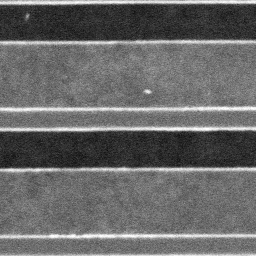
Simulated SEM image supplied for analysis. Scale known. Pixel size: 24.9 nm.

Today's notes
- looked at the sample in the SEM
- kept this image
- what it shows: lines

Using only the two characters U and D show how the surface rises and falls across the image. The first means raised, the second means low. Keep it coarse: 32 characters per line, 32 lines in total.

DDDDDDDDDDDDDDDDDDDDDDDDDDDDDDDD
DDDDDDDDDDDDDDDDDDDDDDDDDDDDDDDD
DDDDDDDDDDDDDDDDDDDDDDDDDDDDDDDD
DDDDDDDDDDDDDDDDDDDDDDDDDDDDDDDD
DDDDDDDDDDDDDDDDDDDDDDDDDDDDDDDD
UUUUUUUUUUUUUUUUUUUUUUUUUUUUUUUU
UUUUUUUUUUUUUUUUUUUUUUUUUUUUUUUU
UUUUUUUUUUUUUUUUUUUUUUUUUUUUUUUU
UUUUUUUUUUUUUUUUUUUUUUUUUUUUUUUU
UUUUUUUUUUUUUUUUUUUUUUUUUUUUUUUU
UUUUUUUUUUUUUUUUUUUUUUUUUUUUUUUU
UUUUUUUUUUUUUUUUUUUUUUUUUUUUUUUU
UUUUUUUUUUUUUUUUUUUUUUUUUUUUUUUU
UUUUUUUUUUUUUUUUUUUUUUUUUUUUUUUU
UUUUUUUUUUUUUUUUUUUUUUUUUUUUUUUU
UUUUUUUUUUUUUUUUUUUUUUUUUUUUUUUU
DDDDDDDDDDDDDDDDDDDDDDDDDDDDDDDD
DDDDDDDDDDDDDDDDDDDDDDDDDDDDDDDD
DDDDDDDDDDDDDDDDDDDDDDDDDDDDDDDD
DDDDDDDDDDDDDDDDDDDDDDDDDDDDDDDD
DDDDDDDDDDDDDDDDDDDDDDDDDDDDDDDD
UUUUUUUUUUUUUUUUUUUUUUUUUUUUUUUU
UUUUUUUUUUUUUUUUUUUUUUUUUUUUUUUU
UUUUUUUUUUUUUUUUUUUUUUUUUUUUUUUU
UUUUUUUUUUUUUUUUUUUUUUUUUUUUUUUU
UUUUUUUUUUUUUUUUUUUUUUUUUUUUUUUU
UUUUUUUUUUUUUUUUUUUUUUUUUUUUUUUU
UUUUUUUUUUUUUUUUUUUUUUUUUUUUUUUU
UUUUUUUUUUUUUUUUUUUUUUUUUUUUUUUU
UUUUUUUUUUUUUUUUUUUUUUUUUUUUUUUU
UUUUUUUUUUUUUUUUUUUUUUUUUUUUUUUU
UUUUUUUUUUUUUUUUUUUUUUUUUUUUUUUU